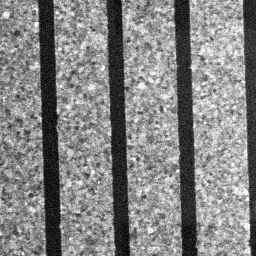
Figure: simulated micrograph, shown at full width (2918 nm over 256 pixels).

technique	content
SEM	one or a few lines or trenches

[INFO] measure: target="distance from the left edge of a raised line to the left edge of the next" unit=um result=0.77